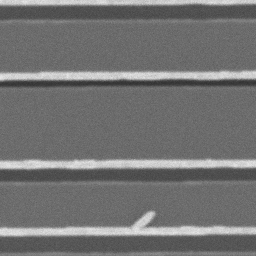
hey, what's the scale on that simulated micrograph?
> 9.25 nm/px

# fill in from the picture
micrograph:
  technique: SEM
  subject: lines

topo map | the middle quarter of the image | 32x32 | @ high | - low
@@@@@@@@@@@@@@@@@@@@@@@@@@@@@@@@
@@@@@@@@@@@@@@@@@@@@@@@@@@@@@@@@
@@@@@@@@@@@@@@@@@@@@@@@@@@@@@@@@
@@@@@@@@@@@@@@@@@@@@@@@@@@@@@@@@
--------------------------------
--------------------------------
@@@@@@@@@@@@@@@@@@@@@@@@@@@@@@@@
@@@@@@@@@@@@@@@@@@@@@@@@@@@@@@@@
@@@@@@@@@@@@@@@@@@@@@@@@@@@@@@@@
@@@@@@@@@@@@@@@@@@@@@@@@@@@@@@@@
@@@@@@@@@@@@@@@@@@@@@@@@@@@@@@@@
@@@@@@@@@@@@@@@@@@@@@@@@@@@@@@@@
@@@@@@@@@@@@@@@@@@@@@@@@@@@@@@@@
@@@@@@@@@@@@@@@@@@@@@@@@@@@@@@@@
@@@@@@@@@@@@@@@@@@@@@@@@@@@@@@@@
@@@@@@@@@@@@@@@@@@@@@@@@@@@@@@@@
@@@@@@@@@@@@@@@@@@@@@@@@@@@@@@@@
@@@@@@@@@@@@@@@@@@@@@@@@@@@@@@@@
@@@@@@@@@@@@@@@@@@@@@@@@@@@@@@@@
@@@@@@@@@@@@@@@@@@@@@@@@@@@@@@@@
@@@@@@@@@@@@@@@@@@@@@@@@@@@@@@@@
@@@@@@@@@@@@@@@@@@@@@@@@@@@@@@@@
@@@@@@@@@@@@@@@@@@@@@@@@@@@@@@@@
@@@@@@@@@@@@@@@@@@@@@@@@@@@@@@@@
@@@@@@@@@@@@@@@@@@@@@@@@@@@@@@@@
@@@@@@@@@@@@@@@@@@@@@@@@@@@@@@@@
--------------------------------
--------------------------------
--------------------------------
--------------------------------
@@@@@@@@@@@@@@@@@@@@@@@@@@@@@@@@
@@@@@@@@@@@@@@@@@@@@@@@@@@@@@@@@